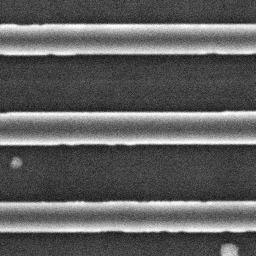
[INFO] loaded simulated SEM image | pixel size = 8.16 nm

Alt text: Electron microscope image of lines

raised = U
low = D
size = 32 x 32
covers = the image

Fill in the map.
DDDDDDDDDDDDDDDDDDDDDDDDDDDDDDDD
DDDDDDDDDDDDDDDDDDDDDDDDDDDDDDDD
DDDDDDDDDDDDDDDDDDDDDDDDDDDDDDDD
UUUUUUUUUUUUUUUUUUUUUUUUUUUUUUUU
UUUUUUUUUUUUUUUUUUUUUUUUUUUUUUUU
UUUUUUUUUUUUUUUUUUUUUUUUUUUUUUUU
UUUUUUUUUUUUUUUUUUUUUUUUUUUUUUUU
DDDDDDDDDDDDDDDDDDDDDDDDDDDDDDDD
DDDDDDDDDDDDDDDDDDDDDDDDDDDDDDDD
DDDDDDDDDDDDDDDDDDDDDDDDDDDDDDDD
DDDDDDDDDDDDDDDDDDDDDDDDDDDDDDDD
DDDDDDDDDDDDDDDDDDDDDDDDDDDDDDDD
DDDDDDDDDDDDDDDDDDDDDDDDDDDDDDDD
DDDDDDDDDDDDDDDDDDDDDDDDDDDDDDDD
UUUUUUUUUUUUUUUUUUUUUUUUUUUUUUUU
UUUUUUUUUUUUUUUUUUUUUUUUUUUUUUUU
UUUUUUUUUUUUUUUUUUUUUUUUUUUUUUUU
UUUUUUUUUUUUUUUUUUUUUUUUUUUUUUUU
DDDDDDDDDDDDDDDDDDDDDDDDDDDDDDDD
DDDDDDDDDDDDDDDDDDDDDDDDDDDDDDDD
DDDDDDDDDDDDDDDDDDDDDDDDDDDDDDDD
DDDDDDDDDDDDDDDDDDDDDDDDDDDDDDDD
DDDDDDDDDDDDDDDDDDDDDDDDDDDDDDDD
DDDDDDDDDDDDDDDDDDDDDDDDDDDDDDDD
DDDDDDDDDDDDDDDDDDDDDDDDDDDDDDDD
UUUUUUUUUUUUUUUUUUUUUUUUUUUUUUUU
UUUUUUUUUUUUUUUUUUUUUUUUUUUUUUUU
UUUUUUUUUUUUUUUUUUUUUUUUUUUUUUUU
UUUUUUUUUUUUUUUUUUUUUUUUUUUUUUUU
DDDDDDDDDDDDDDDDDDDDDDDDDDDDDDDD
DDDDDDDDDDDDDDDDDDDDDDDDDDDDDDDD
DDDDDDDDDDDDDDDDDDDDDDDDDDDDDDDD